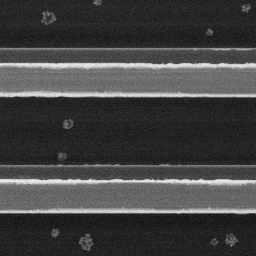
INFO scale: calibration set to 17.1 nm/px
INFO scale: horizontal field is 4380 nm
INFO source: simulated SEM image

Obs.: lines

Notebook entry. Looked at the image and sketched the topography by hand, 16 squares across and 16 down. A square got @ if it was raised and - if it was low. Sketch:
----------------
----------------
----------------
@@@@@@@@@@@@@@@@
@@@@@@@@@@@@@@@@
@@@@@@@@@@@@@@@@
----------------
----------------
----------------
----------------
@@@@@@@@@@@@@@@@
@@@@@@@@@@@@@@@@
@@@@@@@@@@@@@@@@
----------------
----------------
----------------